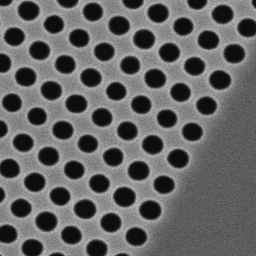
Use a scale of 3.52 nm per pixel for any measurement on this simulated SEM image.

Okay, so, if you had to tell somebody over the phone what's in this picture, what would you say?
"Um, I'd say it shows a regular array of holes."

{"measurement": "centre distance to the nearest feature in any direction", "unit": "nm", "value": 101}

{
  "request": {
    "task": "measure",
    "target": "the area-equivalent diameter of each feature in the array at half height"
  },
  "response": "66.1 nanometres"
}